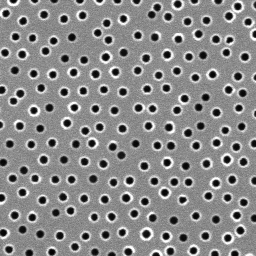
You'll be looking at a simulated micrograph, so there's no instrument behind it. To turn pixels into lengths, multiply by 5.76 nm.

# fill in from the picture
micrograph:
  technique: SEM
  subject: a regular array of holes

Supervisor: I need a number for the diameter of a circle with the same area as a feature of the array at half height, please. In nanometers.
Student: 45.5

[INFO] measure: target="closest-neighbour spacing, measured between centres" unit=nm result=95.3